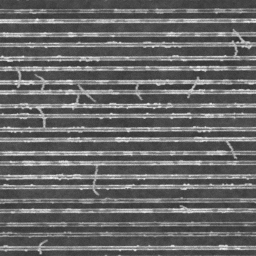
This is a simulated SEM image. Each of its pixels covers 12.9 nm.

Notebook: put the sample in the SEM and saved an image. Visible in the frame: parallel lines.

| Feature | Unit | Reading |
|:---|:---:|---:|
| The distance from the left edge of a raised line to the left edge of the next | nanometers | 153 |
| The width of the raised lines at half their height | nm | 50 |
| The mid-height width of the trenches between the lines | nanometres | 88.8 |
